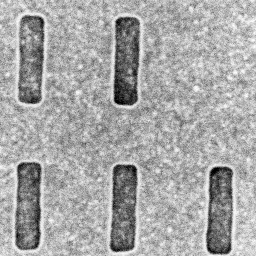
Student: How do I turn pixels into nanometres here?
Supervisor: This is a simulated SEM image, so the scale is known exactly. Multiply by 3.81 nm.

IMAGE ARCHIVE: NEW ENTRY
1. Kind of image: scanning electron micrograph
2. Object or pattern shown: holes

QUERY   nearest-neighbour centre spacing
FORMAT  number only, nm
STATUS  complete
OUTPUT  364